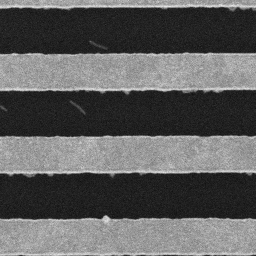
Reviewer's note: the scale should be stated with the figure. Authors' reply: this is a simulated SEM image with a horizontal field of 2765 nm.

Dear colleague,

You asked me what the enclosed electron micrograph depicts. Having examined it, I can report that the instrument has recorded lines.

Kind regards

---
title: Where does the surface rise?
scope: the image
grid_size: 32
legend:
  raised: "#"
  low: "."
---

################################
................................
................................
................................
................................
................................
................................
################################
################################
################################
################################
................................
................................
................................
................................
................................
................................
################################
################################
################################
################################
##########.######.#######.#....#
................................
................................
................................
................................
................................
################################
################################
################################
################################
################################